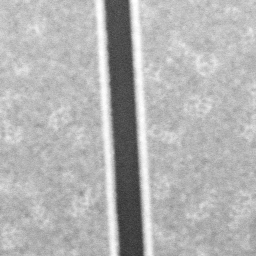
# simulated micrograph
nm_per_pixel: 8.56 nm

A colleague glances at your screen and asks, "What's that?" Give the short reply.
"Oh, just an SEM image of one or a few lines or trenches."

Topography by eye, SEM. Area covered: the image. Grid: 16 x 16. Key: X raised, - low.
XXXXXX--XXXXXXXX
XXXXXX---XXXXXXX
XXXXXX---XXXXXXX
XXXXXX---XXXXXXX
XXXXXX---XXXXXXX
XXXXXX---XXXXXXX
XXXXXXX--XXXXXXX
XXXXXXX--XXXXXXX
XXXXXXX--XXXXXXX
XXXXXXX--XXXXXXX
XXXXXXX--XXXXXXX
XXXXXXX--XXXXXXX
XXXXXXX--XXXXXXX
XXXXXXX--XXXXXXX
XXXXXXX--XXXXXXX
XXXXXXX--XXXXXXX